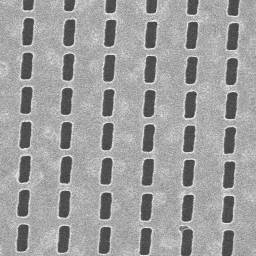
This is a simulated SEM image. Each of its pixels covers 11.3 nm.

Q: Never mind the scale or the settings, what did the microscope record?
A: a regular array of holes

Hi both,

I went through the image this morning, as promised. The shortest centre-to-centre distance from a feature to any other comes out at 386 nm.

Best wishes